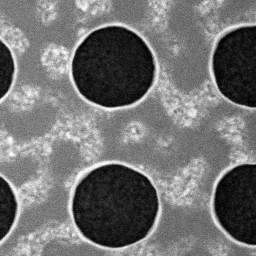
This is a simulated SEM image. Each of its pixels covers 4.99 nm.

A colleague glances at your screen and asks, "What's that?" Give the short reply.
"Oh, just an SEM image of holes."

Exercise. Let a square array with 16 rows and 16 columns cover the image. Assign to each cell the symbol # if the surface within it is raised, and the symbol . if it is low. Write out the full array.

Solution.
################
################
#####....#####..
.####.....###...
.####.....###...
.####....#####..
######..#######.
################
################
################
######..#######.
.####.....####..
.####.....###...
.####.....###...
.####....#####..
################